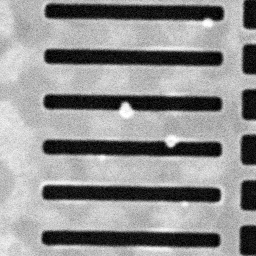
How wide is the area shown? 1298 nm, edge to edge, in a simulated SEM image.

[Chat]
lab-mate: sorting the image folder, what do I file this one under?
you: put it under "groups of lines, slits or small figures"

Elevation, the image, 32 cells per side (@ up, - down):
@@@@@@--------@@-@@@@@@@@@@@@@--
@@@@@-----------------------@@--
@@@@@@@---------------------@@--
@@@@@@@@@@@@@@@@@@@@@@@@@@@@@@@-
@@@@@@@@@@@@@@@@@@@@@@@@@@@@@@@@
@@@@@@@@@@@@@@@@@@@@@@@@@@@@@@@-
@@@@@@----------------------@@--
@@@@@-----------------------@@--
@@@@@@@@@@@@@@@@@@@@@@@@@@@@@@--
@@@@@@@@@@@@@@@@@@@@@@@@@@@@@@@@
@@@@@@@@@@@@@@@@@@@@@@@@@@@@@@@@
@@@@@@@@@@@@@@@@@@@@@@@@@@@@@@--
@@@@@-----------------------@@--
@@@@@@---------@------------@@--
@@@@@@@@@@@@@@@@@@@@@@@@@@@@@@--
@@@@@@@@@@@@@@@@@@@@@@@@@@@@@@@@
@@@@@@@@@@@@@@@@@@@@@@@@@@@@@@@@
@@@@@@----------@@@@@@@@@@@@@@--
@@@@@-----------------------@@--
@@@@@@@---------------------@@--
@@@@@@@@@@@@@@@@@@@@@@@@@@@@@@--
@@@@@@@@@@@@@@@@@@@@@@@@@@@@@@@@
@@@@@@@@@@@@@@@@@@@@@@@@@@@@@@@-
@@@@@----------------------@@@--
@@@@@-----------------------@@--
@@@@@@@@@@@@@@@@@@@@@@@@@@@@@@--
@@@@@@@@@@@@@@@@@@@@@@@@@@@@@@@@
@@@@@@@@@@@@@@@@@@@@@@@@@@@@@@@@
@@@@@@@@@@@@@@@@@@@@@@@@@@@@@@--
@@@@@-----------------------@@--
@@@@@-----------------------@@--
@@@@@@@@@@@@@@@@@@@@@@@@@@@@@@--